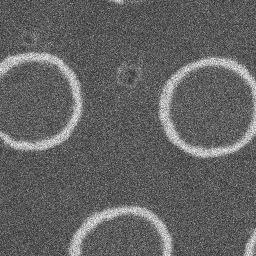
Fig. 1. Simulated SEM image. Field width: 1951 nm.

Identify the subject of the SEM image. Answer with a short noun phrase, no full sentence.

raised bodies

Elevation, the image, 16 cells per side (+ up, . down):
................
................
................
................
++++.......++++.
+++++......+++++
+++++.....++++++
+++++.....++++++
++++.......+++++
............+...
................
................
................
......+++.......
.....+++++......
.....++++++.....